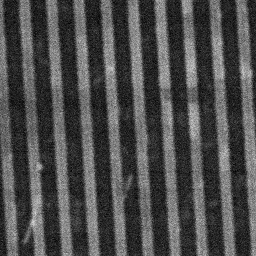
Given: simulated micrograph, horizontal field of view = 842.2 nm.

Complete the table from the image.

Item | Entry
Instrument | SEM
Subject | parallel lines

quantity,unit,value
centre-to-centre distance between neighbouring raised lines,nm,89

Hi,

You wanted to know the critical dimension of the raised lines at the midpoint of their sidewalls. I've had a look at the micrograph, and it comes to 9.15 px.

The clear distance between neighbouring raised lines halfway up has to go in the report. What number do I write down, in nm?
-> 57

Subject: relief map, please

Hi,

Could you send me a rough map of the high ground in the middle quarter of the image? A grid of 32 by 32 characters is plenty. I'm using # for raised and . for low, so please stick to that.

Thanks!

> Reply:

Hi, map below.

....##....###....##.....##.....#
....##....###....##.....##.....#
....##....###....##.....##.....#
....##.....##....##.....##.....#
....##.....##....###....##.....#
....##.....##.....##....##.....#
....##.....##.....##....##.....#
....##.....##.....##....###....#
....##.....##.....##....###....#
....##.....##.....##....###....#
....##.....##.....##....###....#
....##.....##.....##.....##....#
....###....##.....##.....##....#
....###....##.....##.....##.....
.....##....##.....##.....##.....
.....##....###....##.....##.....
.....##....###....##.....##.....
.....##....###....##.....##.....
.....##....###....##.....##.....
.....##.....##....##.....##.....
.....##.....##....###....##.....
.....##.....##....###....##.....
.....##.....##.....##....##.....
.....##.....##.....##....###....
.....##.....##.....##....###....
.....##.....##.....##....###....
.....##.....##.....##....###....
#....##.....##.....##....###....
#....##.....##.....##.....##....
#....###....##.....##.....##....
#.....##....##.....##.....##....
#.....##....###....##.....##....